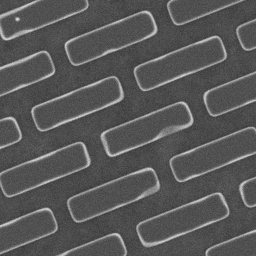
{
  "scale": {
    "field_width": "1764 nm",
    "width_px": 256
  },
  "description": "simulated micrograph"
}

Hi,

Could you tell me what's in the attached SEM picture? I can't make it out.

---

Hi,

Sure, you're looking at groups of lines, slits or small figures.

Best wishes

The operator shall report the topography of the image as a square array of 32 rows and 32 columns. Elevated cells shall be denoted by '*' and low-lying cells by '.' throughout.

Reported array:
....*******..........********...
.*********...........******.....
*******........****...**........
*****........******...........**
**........*********...........**
........*********.......****..**
........******........******....
...***...**........*********....
*******..........*********......
******...........******........*
****........***..***........****
*........******...........******
......*********...........******
....*********........**...****..
....******........******........
**..****.......*********........
***..........********.........**
**...........******........*****
........***..****........*******
......*****...........*********.
...********..........********...
*********........**...****......
*******.......******..*........*
****........********..........**
.*.......*********........**..**
.........*******.......*****...*
....**...****........********...
..*****..**.......*********.....
*******..........********.......
******.......**..*****........**
***........****...*........*****
*.......********..........******